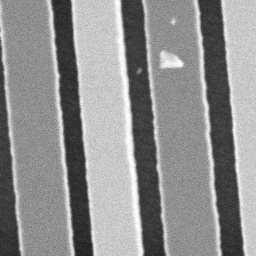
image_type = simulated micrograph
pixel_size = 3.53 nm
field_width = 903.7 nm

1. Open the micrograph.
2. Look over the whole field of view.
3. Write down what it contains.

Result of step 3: lines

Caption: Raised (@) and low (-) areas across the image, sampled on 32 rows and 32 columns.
@@@@@@---@@@@@@---@@@@@@@---@@@@
@@@@@@@--@@@@@@---@@@@@@@---@@@@
@@@@@@@--@@@@@@---@@@@@@@---@@@@
@@@@@@@--@@@@@@---@@@@@@@---@@@@
@@@@@@@--@@@@@@---@@@@@@@---@@@@
@@@@@@@--@@@@@@---@@@@@@@---@@@@
@@@@@@@---@@@@@@--@@@@@@@---@@@@
@@@@@@@---@@@@@@--@@@@@@@---@@@@
-@@@@@@---@@@@@@---@@@@@@@---@@@
-@@@@@@---@@@@@@---@@@@@@@---@@@
-@@@@@@---@@@@@@---@@@@@@@---@@@
-@@@@@@---@@@@@@---@@@@@@@---@@@
-@@@@@@---@@@@@@---@@@@@@@---@@@
-@@@@@@@--@@@@@@---@@@@@@@---@@@
-@@@@@@@--@@@@@@---@@@@@@@---@@@
-@@@@@@@--@@@@@@---@@@@@@@---@@@
-@@@@@@@--@@@@@@---@@@@@@@---@@@
-@@@@@@@--@@@@@@@--@@@@@@@---@@@
-@@@@@@@---@@@@@@---@@@@@@---@@@
--@@@@@@---@@@@@@---@@@@@@---@@@
--@@@@@@---@@@@@@---@@@@@@@--@@@
--@@@@@@---@@@@@@---@@@@@@@---@@
--@@@@@@---@@@@@@---@@@@@@@---@@
--@@@@@@@--@@@@@@---@@@@@@@---@@
--@@@@@@@--@@@@@@---@@@@@@@---@@
--@@@@@@@--@@@@@@---@@@@@@@---@@
--@@@@@@@--@@@@@@---@@@@@@@---@@
--@@@@@@@--@@@@@@@--@@@@@@@---@@
--@@@@@@@--@@@@@@@---@@@@@@---@@
--@@@@@@@--@@@@@@@---@@@@@@---@@
--@@@@@@@---@@@@@@---@@@@@@@--@@
---@@@@@@---@@@@@@---@@@@@@@---@